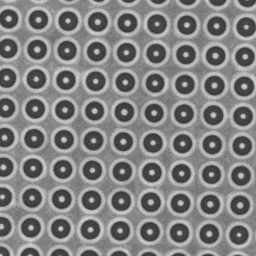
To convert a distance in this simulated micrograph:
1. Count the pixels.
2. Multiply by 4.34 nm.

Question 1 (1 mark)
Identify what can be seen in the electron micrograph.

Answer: an array of small figures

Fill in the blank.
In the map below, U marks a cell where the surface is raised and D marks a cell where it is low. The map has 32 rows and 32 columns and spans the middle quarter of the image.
UUUUUUUUUUUUUUUUUUUUUUUUUUUUUUDU
DUUUUUUDUUUUUUUUUUUUUUUUUUUUUUUU
DDDUUUDDDDUUUDDDDUUUUDDDUUUUUDDU
DDDUUDDDDDDUUDDDDDUUDDDDDUUUDDDD
DDDUUDDDDDDUUDDDDDUUDDDDDDUDDDDD
DDDUUDDDDDDUUDDDDDUUDDDDDUUDDDDD
DDUUUUDDDDUUUDDDDUUUUDDDDUUUDDDD
UUUUUUUUUUUUUUUUUUUUUUDDUUUUUDDD
UUUUUUUUUUUUUUUUUUUUUUUUUUUUUUUU
DDUUUUDDDUUUUUDDUUUUUUUUUUUUUUUU
DDDUUDDDDDUUUDDDDDUUDDDDDUUUDDDD
DDDUUDDDDDUUDDDDDDUUDDDDDUUDDDDD
DDDUUDDDDDUUDDDDDDUUDDDDDUUDDDDD
DDUUUUDDDDUUUDDDDUUUDDDDDUUDDDDD
UUUUUUUDUUUUUUDDDUUUUDDDUUUUDDDD
UUUUUUUUUUUUUUUUUUUUUUUUUUUUUUUU
DUUUUUUDUUUUUUUUUUUUUUUUUUUUUUUU
DDUUUDDDDDUUUDDDDUUUUDDDUUUUDDDU
DDDUDDDDDDUUDDDDDUUUDDDDDUUDDDDD
DDDUDDDDDDUUDDDDDDUDDDDDDUUDDDDD
DDUUUDDDDDUUDDDDDUUUDDDDDUUDDDDD
DUUUUUDDDUUUUDDDDUUUDDDDUUUDDDDD
UUUUUUUUUUUUUUUUUUUUUDDUUUUUDDDU
UUUUUUUUUUUUUUUUUUUUUUUUUUUUUUUU
DDUUUDDDDUUUUDDDUUUUUDDUUUUUUDUU
DDUUDDDDDDUUDDDDDUUUDDDDUUUDDDDU
DDDUDDDDDDUUDDDDDUUDDDDDDUUDDDDD
DDUUDDDDDDUUDDDDDUUDDDDDDUUDDDDD
DUUUUDDDDUUUDDDDDUUDDDDDUUUDDDDD
UUUUUUUUUUUUUDDDUUUUDDDUUUUUDDDU
UUUUUUUUUUUUUUUUUUUUUUUUUUUUUUUU
DUUUUDDDUUUUUDDUUUUUUUUUUUUUUUUU